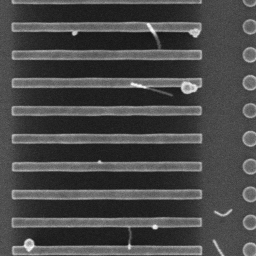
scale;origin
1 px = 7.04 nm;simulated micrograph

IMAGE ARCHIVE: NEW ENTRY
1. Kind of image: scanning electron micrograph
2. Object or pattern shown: groups of lines, slits or small figures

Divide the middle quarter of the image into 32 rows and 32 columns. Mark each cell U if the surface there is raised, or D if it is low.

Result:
DDDDDDDDDDDDDDDDDDDDDDDDDDDDDDDD
DDDDDDDDDDDDDDDDDDDDDDDDDDDDDDDD
DDDDDDDDDDDDDDDDDDDDDDDDDDDDDDDD
DDDDDDDDDDDDDDDDDDDDDDDDDDDDDDDD
UUUUUUUUUUUUUUUUUUUUUUUUUUUUUUUU
UUUUUUUUUUUUUUUUUUUUUUUUUUUUUUUU
DDDDDDDDDDDDDDDDDDDDDDDDDDDDDUUU
DDDDDDDDDDDDDDDDDDDDDDDDDDDDDDDD
DDDDDDDDDDDDDDDDDDDDDDDDDDDDDDDD
DDDDDDDDDDDDDDDDDDDDDDDDDDDDDDDD
DDDDDDDDDDDDDDDDDDDDDDDDDDDDDDDD
UUUUUUUUUUUUUUUUUUUUUUUUUUUUUUUU
UUUUUUUUUUUUUUUUUUUUUUUUUUUUUUUU
DDDDDDDDDDDDDDDDDDDDDDDDDDDDDDDD
DDDDDDDDDDDDDDDDDDDDDDDDDDDDDDDD
DDDDDDDDDDDDDDDDDDDDDDDDDDDDDDDD
DDDDDDDDDDDDDDDDDDDDDDDDDDDDDDDD
DDDDDDDDDDDDDDDDDDDDDDDDDDDDDDDD
UUUUUUUUUUUUUUUUUUUUUUUUUUUUUUUU
UUUUUUUUUUUUUUUUUUUUUUUUUUUUUUUU
DDDDDDDDDDDDDDDDDDDDDDDDDDDDDDDD
DDDDDDDDDDDDDDDDDDDDDDDDDDDDDDDD
DDDDDDDDDDDDDDDDDDDDDDDDDDDDDDDD
DDDDDDDDDDDDDDDDDDDDDDDDDDDDDDDD
DDDDDDDDUUDDDDDDDDUUUDDDUUUUUUUU
UUUUUUUUUUUUUUUUUUUUUUUUUUUUUUUU
UUUUUUUUUUUUUUUUUUUUUUUUUUUUUUUU
DDDDDDDDDDDDDDDDDDDDDDDDDDDDDDDD
DDDDDDDDDDDDDDDDDDDDDDDDDDDDDDDD
DDDDDDDDDDDDDDDDDDDDDDDDDDDDDDDD
DDDDDDDDDDDDDDDDDDDDDDDDDDDDDDDD
DDDDDDDDDDDDDDDDDDDDDDDDDDDDDUUU